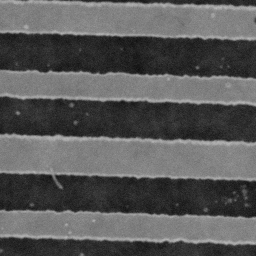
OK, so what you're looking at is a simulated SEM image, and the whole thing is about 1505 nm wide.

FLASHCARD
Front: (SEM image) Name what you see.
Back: lines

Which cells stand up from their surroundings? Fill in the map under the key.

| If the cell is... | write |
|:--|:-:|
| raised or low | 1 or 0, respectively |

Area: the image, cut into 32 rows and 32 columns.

11111111111111111101100000000000
11111111111111111111111111111111
11111111111111111111111111111111
11111111111111111111111111111111
00000000000000010001111111111111
00000000000000000000000000000000
00000000000000000000000000000000
00000000000000000000000000000000
00000000000000000000000000000000
11111111111111111111110000000000
11111111111111111111111111111111
11111111111111111111111111111111
00000000000111111111111111111111
00000000000000000000000000000000
00000000000000000000000000000000
00000000000000000000000000000000
00000000000000000000000000000000
11111111111111111111111100000000
11111111111111111111111111111111
11111111111111111111111111111111
11111111111111111111111111111111
11111111111111111111111111111111
00000000000000000000000000000001
00000000000000000000000000000000
00000000000000000000000000000000
00000000000000000000000000000000
11111111111100000000000000000000
11111111111111111111111111111111
11111111111111111111111111111111
11111111111111111111111111111111
00000000000000000000000000001101
00000000000000000000000000000000